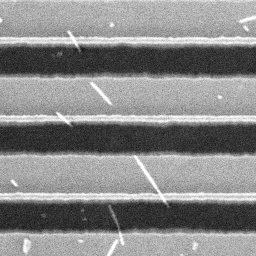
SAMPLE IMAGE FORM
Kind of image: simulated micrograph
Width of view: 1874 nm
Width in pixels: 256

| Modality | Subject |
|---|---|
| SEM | lines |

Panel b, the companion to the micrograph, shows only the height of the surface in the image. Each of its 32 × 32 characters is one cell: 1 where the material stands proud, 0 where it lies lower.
11111111111111111111111111111111
11111111111111111111111111111111
11111111111111111111111111111111
11111111111111111111111111111111
11111111111111111111111111111111
00000000010000000000000000000000
00000000000000000000000000000000
00000000000000000000000000000000
00000000000000000000000000000000
00000000000000000000000000000000
11111111111111111111111111111111
11111111111111111111111111111111
11111111111111111111111111111111
11111111111111111111111111111111
11111111111111111111111111111111
00000000000000000000000000000000
00000000000000000000000000000000
00000000000000000000000000000000
00000000000000000000000000000000
11111111111111011011111000111010
11111111111111111111111111111111
11111111111111111111111111111111
11111111111111111111111111111111
11111111111111111111111111111111
11111111111111111111111111111111
00000000000000000000000000000000
00000000000000000000000000000000
00000000000000000000000000000000
00000000000000000000000000000000
11111111111111111111111111111111
11111111111111111111111111111111
11111111111111111111111111111111